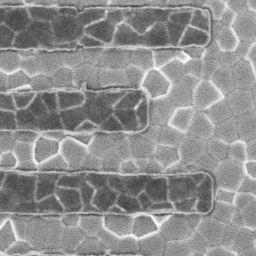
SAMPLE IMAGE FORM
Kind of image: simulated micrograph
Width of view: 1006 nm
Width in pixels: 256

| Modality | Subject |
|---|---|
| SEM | one or a few lines or trenches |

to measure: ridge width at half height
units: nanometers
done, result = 159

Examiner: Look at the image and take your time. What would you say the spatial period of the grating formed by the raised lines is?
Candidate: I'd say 325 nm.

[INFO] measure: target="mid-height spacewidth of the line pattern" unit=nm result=162